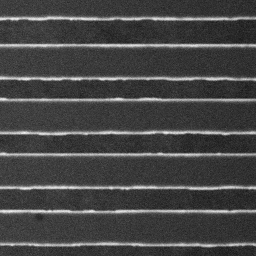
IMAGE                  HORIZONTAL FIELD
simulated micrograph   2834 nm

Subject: lines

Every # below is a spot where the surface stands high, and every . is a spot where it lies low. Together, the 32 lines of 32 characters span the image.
################################
################################
................................
................................
................................
................................
################################
################################
################################
################################
................................
................................
################################
################################
################################
################################
################################
................................
................................
################################
################################
################################
################################
..##...................####.....
................................
................................
################################
################################
################################
################################
################################
................................